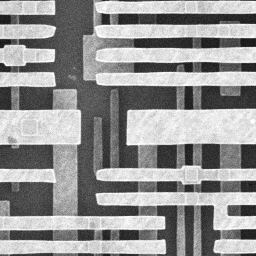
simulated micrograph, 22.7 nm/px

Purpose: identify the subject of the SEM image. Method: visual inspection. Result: wiring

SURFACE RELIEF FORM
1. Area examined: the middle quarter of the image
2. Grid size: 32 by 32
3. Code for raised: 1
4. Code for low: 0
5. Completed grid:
00000000000000000000000000000000
00000000000000000000000000000000
00000000111111111111111111111111
00000000111111111111111111111111
00000000111111111111111111111111
00000000000000000000000000000000
00000000000000000000000000000000
00000000000000000000000000000000
00000000000000000000000000000000
00000000000000000000000000000000
00000000000000000000000000000000
00000000000000000000000000000000
11110000000000001111111111111111
11110000000000001111111111111111
11110000000000001111111111111111
11110000000000001111111111111111
11110000000000001111111111111111
11110000000000001111111111111111
11110000000000001111111111111111
11110000000000001111111111111111
00000000000000000000000000000000
00000000000000000000000000000000
00000000000000000000000000000000
00000000000000000000000000000000
00000000000000000000000000000000
00000000000000000000000000000000
00000000011111111111111111111111
00000000111111111111111111111111
00000000111111111111111111111111
00000000000000000000000000000111
00000000000000000000000000000000
00000000000000000000000000000000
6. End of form